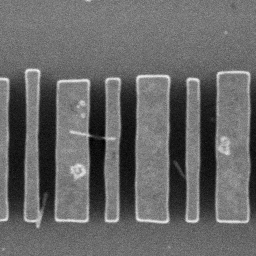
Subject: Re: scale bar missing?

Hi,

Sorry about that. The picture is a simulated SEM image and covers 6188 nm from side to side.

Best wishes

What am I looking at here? groups of lines, slits or small figures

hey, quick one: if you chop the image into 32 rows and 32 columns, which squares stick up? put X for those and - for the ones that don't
--------------------------------
--------------------------------
--------------------------------
--------------------------------
--------------------------------
--------------------------------
--------------------------------
--------------------------------
--------------------------------
---XX----------------------XXXX-
X--XX--XXXX--XX--XXXX--XX--XXXX-
X--XX--XXXX--XX--XXXX--XX--XXXX-
X--XX--XXXX--XX--XXXX--XX--XXXX-
X--XX--XXXX--XX--XXXX--XX--XXXX-
X--XX--XXXX--XX--XXXX--XX--XXXX-
X--XX--XXXX--XX--XXXX--XX--XXXX-
X--XX--XXXX--XX--XXXX--XX--XXXX-
X--XX--XXXX--XX--XXXX--XX--XXXX-
X--XX--XXXX--XX--XXXX--XX--XXXX-
X--XX--XXXX--XX--XXXX--XX--XXXX-
X--XX--XXXX--XX--XXXX--XX--XXXX-
X--XX--XXXX--XX--XXXX--XX--XXXX-
X--XX--XXXX--XX--XXXX--XX--XXXX-
X--XX--XXXX--XX--XXXX--XX--XXXX-
X--XX--XXXX--XX--XXXX--XX--XXXX-
X--XX--XXXX--XX--XXXX--XX--XXXX-
X--XX--XXXX--XX--XXXX--XX--XXXX-
X--XX--XXXX--X---XXXX------XXXX-
--------------------------------
--------------------------------
--------------------------------
--------------------------------